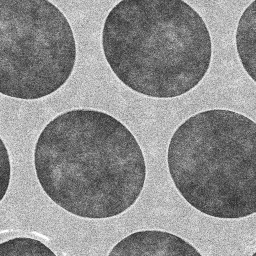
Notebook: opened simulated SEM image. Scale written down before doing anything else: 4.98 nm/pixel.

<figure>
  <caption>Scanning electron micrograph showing holes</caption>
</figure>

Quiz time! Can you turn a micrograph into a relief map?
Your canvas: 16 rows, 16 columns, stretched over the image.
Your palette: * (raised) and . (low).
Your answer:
....***.....***.
....***......**.
.....*.......**.
.....**......**.
....***......**.
....****....****
****************
***....*****....
**......***.....
**.......*......
.*.......**.....
.**......**.....
***.....****....
*****..******..*
*********.******
...****.....****